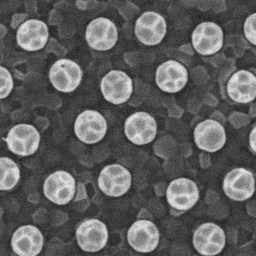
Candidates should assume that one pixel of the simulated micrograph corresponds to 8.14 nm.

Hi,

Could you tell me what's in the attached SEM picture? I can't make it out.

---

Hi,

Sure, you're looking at a regular array of raised bodies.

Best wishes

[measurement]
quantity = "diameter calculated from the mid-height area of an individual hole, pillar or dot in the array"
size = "249 nanometres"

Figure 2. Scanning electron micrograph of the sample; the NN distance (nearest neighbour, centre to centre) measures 429 nm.